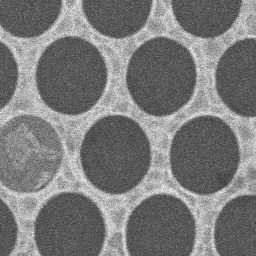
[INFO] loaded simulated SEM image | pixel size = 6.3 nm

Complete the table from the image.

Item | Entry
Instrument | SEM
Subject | holes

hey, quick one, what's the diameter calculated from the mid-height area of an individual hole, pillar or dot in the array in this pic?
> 474 nm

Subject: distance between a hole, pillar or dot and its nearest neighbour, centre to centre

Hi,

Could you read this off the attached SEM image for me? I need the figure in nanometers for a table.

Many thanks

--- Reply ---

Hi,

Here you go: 564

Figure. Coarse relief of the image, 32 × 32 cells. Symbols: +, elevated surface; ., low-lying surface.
........++.........++.........++
........++.........+++........++
.......++++.......++++........++
......++++++......+++++......+++
++...++++++++...++++++++...+++++
++++++.....+++++++.....++++++...
.++++........++++.......++++....
..+++........+++........+++.....
..+++........+++........+++.....
..++.........+++.........++.....
..+++........+++........+++.....
..+++........+++........+++.....
.++++.......+++++.......++++....
++++++.....++++++......+++++....
++...+++++++++.++++..++++..+++..
......++++++.....++++++.....++++
.......++++.......++++.......+++
........++.........+++........++
........++.........++.........++
........++.........++.........++
........++.........++.........++
.......+++........+++.........++
.......++++.......++++.......+++
+....+++++++.....++++++.....++++
+++++++....++++++++...++++++++..
.+++++......+++++......+++++....
.++++........++++.......+++.....
..++.........+++........+++.....
..++.........+++........+++.....
..++.........+++........+++.....
..++.........+++........+++.....
.++++........+++........+++.....